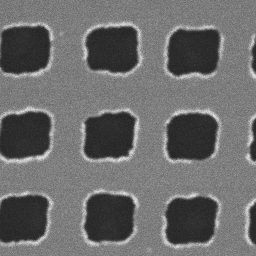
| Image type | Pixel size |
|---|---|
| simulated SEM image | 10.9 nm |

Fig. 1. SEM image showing holes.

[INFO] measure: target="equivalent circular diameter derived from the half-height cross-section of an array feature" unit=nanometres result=576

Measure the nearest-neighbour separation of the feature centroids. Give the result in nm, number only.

886